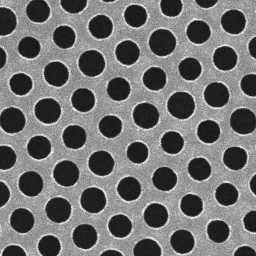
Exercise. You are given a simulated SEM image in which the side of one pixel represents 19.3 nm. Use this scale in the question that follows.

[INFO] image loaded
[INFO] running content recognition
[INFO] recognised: a regular array of holes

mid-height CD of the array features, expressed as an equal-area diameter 470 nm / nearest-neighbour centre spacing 709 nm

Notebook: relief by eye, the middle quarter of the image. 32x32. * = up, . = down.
.***......*******************...
.***......***********....****...
.****....***********.....****...
.************.******......****..
.**********.....****......******
***********.....****.....*******
***...*****......*****..********
**.....****.....***********....*
**......****....**********......
**......******************......
**......**********....****......
***....**********......***......
*****************.......***.....
**********....***.......****...*
*********.....****......********
*...*****......****....*********
.....****.....******************
......****....***********....***
......*****.************......**
.....*************.*****......**
*....***********.....***......**
****************.....****....***
*******.....****.....*****..****
******......****.....***********
..****.......****...***********.
...***.......******************.
....***.....***********....****.
....****...***********......***.
....***********...****......****
...***********.....***......****
..***********......****.....****
*****....****......*****...*****